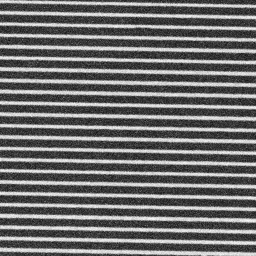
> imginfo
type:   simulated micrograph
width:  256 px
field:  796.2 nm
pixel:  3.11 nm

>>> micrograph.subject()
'parallel lines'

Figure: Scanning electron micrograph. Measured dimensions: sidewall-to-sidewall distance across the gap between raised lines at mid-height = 26.1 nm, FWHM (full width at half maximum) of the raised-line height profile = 8.6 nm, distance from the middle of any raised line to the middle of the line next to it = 35.1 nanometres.